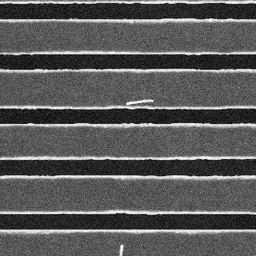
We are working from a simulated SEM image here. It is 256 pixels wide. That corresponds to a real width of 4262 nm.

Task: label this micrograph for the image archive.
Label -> lines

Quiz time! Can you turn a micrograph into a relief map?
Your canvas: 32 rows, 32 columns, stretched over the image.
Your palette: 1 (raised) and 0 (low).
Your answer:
00000000000000000000000000000000
00000000000000000000000000000000
00000000000000000000000000100000
11111111111111111111111111111111
11111111111111111111111111111111
11111111111111111111111111111111
11111111111111111111111111111111
00000000000000000000000000000000
00000000000000000000000000000000
11111111111111111111111111111111
11111111111111111111111111111111
11111111111111111111111111111111
11111111111111111111111111111111
00000011011111000011010111110000
00000000000000000000000000000000
00010000011000000000001110000000
11111111111111111111111111111111
11111111111111111111111111111111
11111111111111111111111111111111
11111111111111111111111111111111
00000000000000000000000000000000
00000000000000000000000000000000
11111111111111111111111111111111
11111111111111111111111111111111
11111111111111111111111111111111
11111111111111111111111111111111
11111111111111111111111111111111
00000000000000000000000000000000
00000000000000000000000000000000
11111111111111111111111111111111
11111111111111111111111111111111
11111111111111111111111111111111